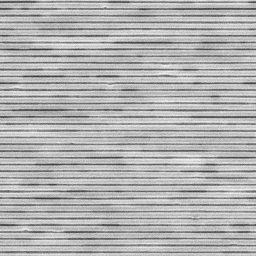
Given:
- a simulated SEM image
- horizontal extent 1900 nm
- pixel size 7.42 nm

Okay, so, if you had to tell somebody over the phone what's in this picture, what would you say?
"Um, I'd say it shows parallel lines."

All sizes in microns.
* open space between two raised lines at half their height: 0.0195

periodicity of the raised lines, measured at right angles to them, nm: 50.2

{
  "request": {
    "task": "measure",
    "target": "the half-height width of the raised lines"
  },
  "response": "32.5 nm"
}